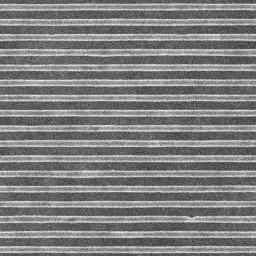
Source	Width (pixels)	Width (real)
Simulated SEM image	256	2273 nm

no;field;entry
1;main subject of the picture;parallel lines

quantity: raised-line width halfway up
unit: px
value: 5.87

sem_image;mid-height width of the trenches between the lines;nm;83.2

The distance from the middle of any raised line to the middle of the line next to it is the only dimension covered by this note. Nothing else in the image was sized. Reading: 134 nm